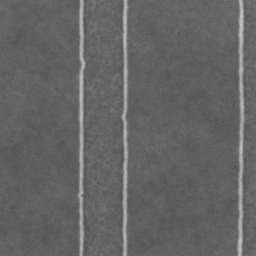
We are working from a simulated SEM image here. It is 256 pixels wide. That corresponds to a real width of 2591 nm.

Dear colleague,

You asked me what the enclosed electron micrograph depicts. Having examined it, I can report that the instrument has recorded one or a few lines or trenches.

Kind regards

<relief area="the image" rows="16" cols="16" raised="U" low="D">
UUUUUDDDUUUUUUUD
UUUUUDDDUUUUUUUD
UUUUUDDDUUUUUUUD
UUUUUDDDUUUUUUUD
UUUUUDDDUUUUUUUD
UUUUUDDDUUUUUUUD
UUUUUDDDUUUUUUUD
UUUUUDDDUUUUUUUD
UUUUUDDDUUUUUUUD
UUUUUDDDUUUUUUUD
UUUUUDDDUUUUUUUD
UUUUUDDDUUUUUUUD
UUUUUDDDUUUUUUUD
UUUUUDDDUUUUUUUD
UUUUUDDDUUUUUUUD
UUUUUDDDUUUUUUUD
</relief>